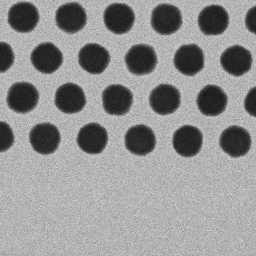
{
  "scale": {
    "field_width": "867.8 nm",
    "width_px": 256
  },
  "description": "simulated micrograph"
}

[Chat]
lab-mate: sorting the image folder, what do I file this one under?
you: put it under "a regular array of holes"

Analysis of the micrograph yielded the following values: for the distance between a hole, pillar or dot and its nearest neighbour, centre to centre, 0.157 µm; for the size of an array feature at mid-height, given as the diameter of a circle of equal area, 29.1 px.